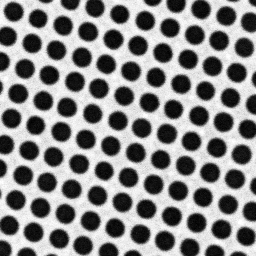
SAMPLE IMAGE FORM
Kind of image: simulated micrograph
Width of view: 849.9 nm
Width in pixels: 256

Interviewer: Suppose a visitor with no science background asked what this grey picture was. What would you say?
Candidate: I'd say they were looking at a regular array of holes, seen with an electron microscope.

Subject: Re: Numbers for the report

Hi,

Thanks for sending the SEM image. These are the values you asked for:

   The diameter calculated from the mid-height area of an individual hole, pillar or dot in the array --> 0.0674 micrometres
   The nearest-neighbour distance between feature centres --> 84.1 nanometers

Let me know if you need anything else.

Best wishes